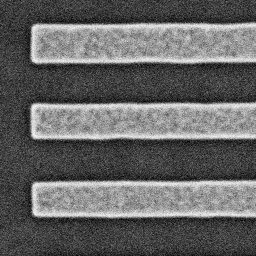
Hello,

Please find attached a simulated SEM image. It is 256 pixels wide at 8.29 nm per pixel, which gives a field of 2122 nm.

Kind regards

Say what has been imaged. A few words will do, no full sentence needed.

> wiring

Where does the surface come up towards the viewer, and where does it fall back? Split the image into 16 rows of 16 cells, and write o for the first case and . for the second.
................
................
..oooooooooooooo
..oooooooooooooo
................
................
................
..oooooooooooooo
..oooooooooooooo
................
................
..oooooooooooooo
..oooooooooooooo
................
................
................